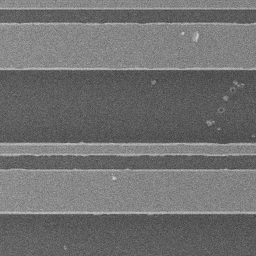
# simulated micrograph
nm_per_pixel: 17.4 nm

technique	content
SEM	lines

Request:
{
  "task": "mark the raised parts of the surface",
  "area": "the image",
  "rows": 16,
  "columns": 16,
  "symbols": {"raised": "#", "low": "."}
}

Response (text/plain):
################
################
################
################
................
................
................
................
................
################
################
################
################
................
................
................